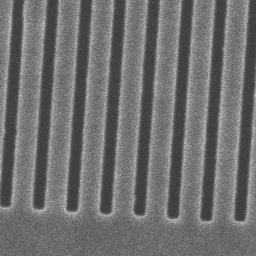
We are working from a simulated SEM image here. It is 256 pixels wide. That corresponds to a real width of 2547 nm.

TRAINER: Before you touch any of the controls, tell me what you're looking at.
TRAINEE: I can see parallel lines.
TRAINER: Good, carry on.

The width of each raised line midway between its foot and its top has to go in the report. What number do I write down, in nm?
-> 228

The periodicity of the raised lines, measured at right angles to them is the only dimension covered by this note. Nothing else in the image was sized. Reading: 334 nm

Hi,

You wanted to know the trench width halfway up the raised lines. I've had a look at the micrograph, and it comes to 109 nm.